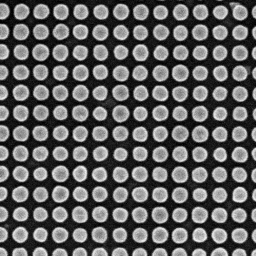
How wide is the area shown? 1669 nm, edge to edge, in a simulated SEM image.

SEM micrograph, a regular array of raised bodies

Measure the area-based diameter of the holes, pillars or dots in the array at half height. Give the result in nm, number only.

96.6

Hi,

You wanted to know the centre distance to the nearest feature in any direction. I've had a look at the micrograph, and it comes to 128 nm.